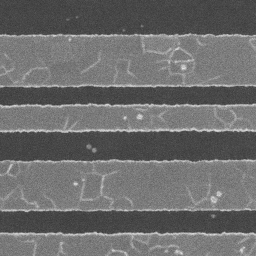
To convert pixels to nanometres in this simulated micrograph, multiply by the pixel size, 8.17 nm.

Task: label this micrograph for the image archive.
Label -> lines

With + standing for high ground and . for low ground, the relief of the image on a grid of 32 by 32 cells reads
................................
................................
................................
................................
++++++++++++++++++++++++++++++++
++++++++++++++++++++++++++++++++
++++++++++++++++++++++++++++++++
++++++++++++++++++++++++++++++++
++++++++++++++++++++++++++++++++
++++++++++++++++++++++++++++++++
++++++++++++++++++++++++++++++++
................................
................................
++++++++++++++++++++++++++++++++
++++++++++++++++++++++++++++++++
++++++++++++++++++++++++++++++++
.+......+.......................
................................
................................
................................
++++++++++++++++++++++++++++++++
++++++++++++++++++++++++++++++++
++++++++++++++++++++++++++++++++
++++++++++++++++++++++++++++++++
++++++++++++++++++++++++++++++++
++++++++++++++++++++++++++++++++
................................
................................
................................
++++++++++++++++++++++++++++++++
++++++++++++++++++++++++++++++++
++++++++++++++++++++++++++++++++